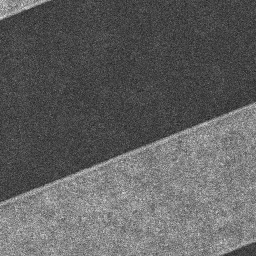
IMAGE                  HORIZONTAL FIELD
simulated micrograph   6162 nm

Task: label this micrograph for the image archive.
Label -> one or a few lines or trenches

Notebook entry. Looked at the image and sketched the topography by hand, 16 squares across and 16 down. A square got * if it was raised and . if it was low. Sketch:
**..............
................
................
................
................
................
................
.............***
...........*****
........********
......**********
...*************
.***************
****************
****************
***************.